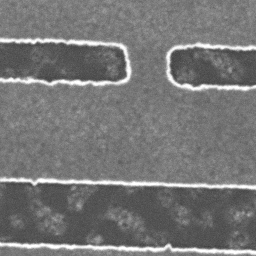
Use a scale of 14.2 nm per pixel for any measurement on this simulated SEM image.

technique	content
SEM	one or a few lines or trenches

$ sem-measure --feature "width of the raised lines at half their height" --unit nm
1420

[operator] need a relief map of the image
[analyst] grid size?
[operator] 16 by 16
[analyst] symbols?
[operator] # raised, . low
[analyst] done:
################
################
################
........###.....
........###.....
################
################
################
################
################
################
........########
................
................
................
#######...#.....